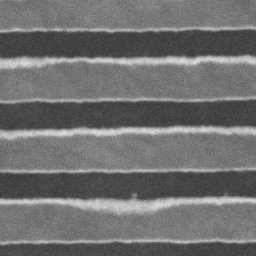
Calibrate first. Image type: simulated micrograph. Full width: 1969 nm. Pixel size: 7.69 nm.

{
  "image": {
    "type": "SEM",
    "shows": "lines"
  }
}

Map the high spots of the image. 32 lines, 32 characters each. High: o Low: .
oooooooooooooooooooooooooooooooo
oooooooooooooooooooooooooooooooo
oooooooooooooooooooooooooooooooo
oooooooooooooooooooooooooooooooo
................................
................................
................................
..oooooooooooooooooooooooooooooo
oooooooooooooooooooooooooooooooo
oooooooooooooooooooooooooooooooo
oooooooooooooooooooooooooooooooo
oooooooooooooooooooooooooooooooo
oooooooooooooooooooooooooooo....
................................
................................
................................
oooooooooooooooooooooooooooooooo
oooooooooooooooooooooooooooooooo
oooooooooooooooooooooooooooooooo
oooooooooooooooooooooooooooooooo
oooooooooooooooooooooooooooooooo
ooooooooooo..oooo...............
................................
................................
................................
oooooooooooooooooooooooooooooooo
oooooooooooooooooooooooooooooooo
oooooooooooooooooooooooooooooooo
oooooooooooooooooooooooooooooooo
oooooooooooooooooooooooooooooooo
o...............................
................................